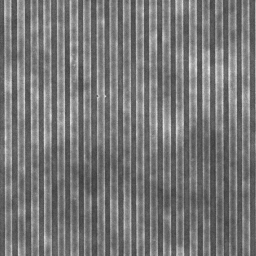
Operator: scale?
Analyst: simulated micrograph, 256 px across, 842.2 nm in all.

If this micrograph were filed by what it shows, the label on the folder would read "parallel lines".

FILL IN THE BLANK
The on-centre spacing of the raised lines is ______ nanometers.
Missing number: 43.4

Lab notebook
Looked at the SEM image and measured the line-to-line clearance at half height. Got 17.7 nanometres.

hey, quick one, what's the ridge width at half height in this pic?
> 24.7 nm